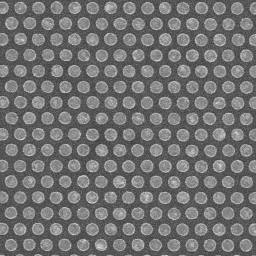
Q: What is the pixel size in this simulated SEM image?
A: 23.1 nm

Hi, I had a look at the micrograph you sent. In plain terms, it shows a regular array of raised bodies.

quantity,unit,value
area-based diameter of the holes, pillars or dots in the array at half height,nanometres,274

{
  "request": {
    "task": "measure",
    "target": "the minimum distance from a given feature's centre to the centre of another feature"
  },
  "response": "0.411 µm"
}